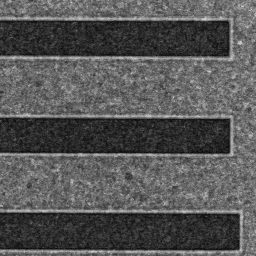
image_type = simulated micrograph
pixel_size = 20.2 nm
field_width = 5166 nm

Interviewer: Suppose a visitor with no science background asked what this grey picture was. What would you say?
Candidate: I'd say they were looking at one or a few lines or trenches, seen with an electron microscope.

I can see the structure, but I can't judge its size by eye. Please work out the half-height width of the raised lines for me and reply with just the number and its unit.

1160 nm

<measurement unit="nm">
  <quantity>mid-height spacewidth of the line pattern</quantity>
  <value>800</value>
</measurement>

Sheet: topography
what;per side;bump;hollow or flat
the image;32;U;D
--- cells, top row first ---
UUUUUUUUUUUUUUUUUUUUUUUUUUUUUUUU
UUUUUUUUUUUUUUUUUUUUUUUUUUUUUUUU
DDDDDDDDDDDDDDDDDDDDDDDDDDDDDUUU
DDDDDDDDDDDDDDDDDDDDDDDDDDDDDUUU
DDDDDDDDDDDDDDDDDDDDDDDDDDDDDUUU
DDDDDDDDDDDDDDDDDDDDDDDDDDDDDUUU
DDDDDDDDDDDDDDDDDDDDDDDDDDDDDUUU
UUUUUUUUUUUUUUUUUUUUUUUUUUUUUUUU
UUUUUUUUUUUUUUUUUUUUUUUUUUUUUUUU
UUUUUUUUUUUUUUUUUUUUUUUUUUUUUUUU
UUUUUUUUUUUUUUUUUUUUUUUUUUUUUUUU
UUUUUUUUUUUUUUUUUUUUUUUUUUUUUUUU
UUUUUUUUUUUUUUUUUUUUUUUUUUUUUUUU
UUUUUUUUUUUUUUUUUUUUUUUUUUUUUUUU
DDDDDDDDDDDDDDDDDDDDDDDDDDDDUUUU
DDDDDDDDDDDDDDDDDDDDDDDDDDDDDUUU
DDDDDDDDDDDDDDDDDDDDDDDDDDDDDUUU
DDDDDDDDDDDDDDDDDDDDDDDDDDDDDUUU
DDDDDDDDDDDDDDDDDDDDDDDDDDDDDUUU
UUUUUUUUUUUUUUUUUUUUUUUUUUUUUUUU
UUUUUUUUUUUUUUUUUUUUUUUUUUUUUUUU
UUUUUUUUUUUUUUUUUUUUUUUUUUUUUUUU
UUUUUUUUUUUUUUUUUUUUUUUUUUUUUUUU
UUUUUUUUUUUUUUUUUUUUUUUUUUUUUUUU
UUUUUUUUUUUUUUUUUUUUUUUUUUUUUUUU
UUUUUUUUUUUUUUUUUUUUUUUUUUUUUUUU
DDDDDDDDDDDDDDDDDDDDDDDDDDDDDDUU
DDDDDDDDDDDDDDDDDDDDDDDDDDDDDDUU
DDDDDDDDDDDDDDDDDDDDDDDDDDDDDDUU
DDDDDDDDDDDDDDDDDDDDDDDDDDDDDDUU
DDDDDDDDDDDDDDDDDDDDDDDDDDDDDDUU
UUUDDDDDDDDDDDDDDDDDDDDDDDDDDDUU